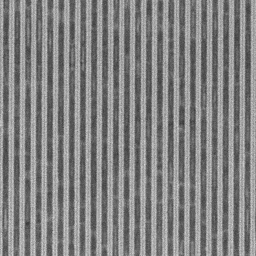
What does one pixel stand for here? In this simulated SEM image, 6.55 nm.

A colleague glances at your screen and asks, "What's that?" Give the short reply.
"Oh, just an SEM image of parallel lines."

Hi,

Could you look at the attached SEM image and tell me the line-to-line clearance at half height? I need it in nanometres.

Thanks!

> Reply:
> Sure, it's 50.8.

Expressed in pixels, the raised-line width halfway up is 3.5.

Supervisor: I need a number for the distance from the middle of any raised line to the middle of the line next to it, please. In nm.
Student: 72